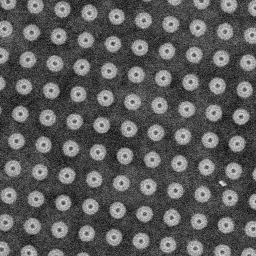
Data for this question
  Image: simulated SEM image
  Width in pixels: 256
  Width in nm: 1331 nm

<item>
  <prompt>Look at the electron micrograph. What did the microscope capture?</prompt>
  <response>an array of small figures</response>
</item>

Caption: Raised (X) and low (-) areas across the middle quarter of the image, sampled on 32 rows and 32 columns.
--XXXX----XXX-------------------
---XXX---XXXX---XXXX------------
---XX----XXXX---XXXX---XXXX-----
----------XX----XXXX---XXXX---XX
------------------X----XXXX---XX
------------------------X-----XX
--XXX--------------------------X
--XXX----XXX--------------------
--XXX---XXXX---XXXX----XX-------
---------XXX---XXXX---XXXX----X-
---------------XXXX---XXXX---XXX
----------------------XXX----XXX
-----------------------------XXX
-XXX-----X----------------------
-XXXX---XXX----XX---------------
-XXX---XXXX---XXXX----XX--------
--------XXX---XXXX---XXXX----XX-
---------------XXX---XXXX---XXXX
----------------------XX----XXXX
-XX-------------------------XXX-
XXXX---XXX----------------------
XXXX---XXX----XX----------------
XXX----XXX---XXXX----XX---------
-------XXX---XXXX---XXXX----XX--
--------------XX----XXXX---XXXX-
---------------------XX----XXXX-
XX--------------------------XX--
XXX---XXX-----------------------
XXX---XXX----XXX----------------
XX----XXX---XXXX----XXX---------
-------XX---XXXX---XXXX---XXX---
-------------XX----XXXX---XXXX--